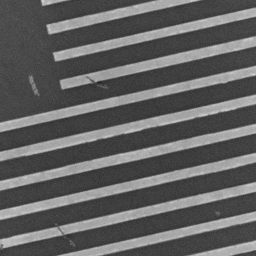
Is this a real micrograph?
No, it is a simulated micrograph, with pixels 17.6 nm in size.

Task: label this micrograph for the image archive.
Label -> parallel lines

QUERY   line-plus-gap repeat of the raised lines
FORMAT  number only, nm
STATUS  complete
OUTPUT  502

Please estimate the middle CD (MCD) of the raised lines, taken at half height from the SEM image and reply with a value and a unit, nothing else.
155 nanometers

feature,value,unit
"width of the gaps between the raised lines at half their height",340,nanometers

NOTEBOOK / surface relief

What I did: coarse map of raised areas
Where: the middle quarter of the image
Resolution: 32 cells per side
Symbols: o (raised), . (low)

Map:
...............ooooooooooo......
..........ooooooooooo...........
......ooooooooooo...............
..oooooooooo....................
oooooooo......................oo
ooo.......................oooooo
.....................oooooooooo.
.................ooooooooo......
............oooooooooo..........
........oooooooooo..............
...oooooooooo...................
ooooooooo......................o
oooo.......................ooooo
......................oooooooooo
..................ooooooooo.....
.............oooooooooo.........
.........ooooooooo..............
....oooooooooo..................
ooooooooo.......................
ooooo......................ooooo
........................oooooooo
...................oooooooooo...
..............ooooooooooo.......
..........oooooooooo............
.....ooooooooooo................
.oooooooooo.....................
ooooooo......................ooo
oo.......................ooooooo
....................oooooooooo..
................oooooooooo......
...........oooooooooo...........
.......ooooooooooo..............